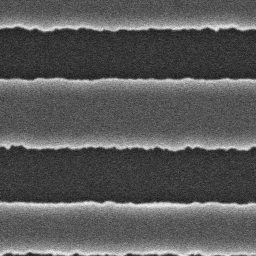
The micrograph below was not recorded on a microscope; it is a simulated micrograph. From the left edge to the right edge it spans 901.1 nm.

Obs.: lines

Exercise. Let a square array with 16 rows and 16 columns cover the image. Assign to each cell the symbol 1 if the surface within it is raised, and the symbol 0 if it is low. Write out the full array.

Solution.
1111111111111111
1111111111111111
0000000000000000
0000000000000000
0000000000000000
1111111111111111
1111111111111111
1111111111111111
1111111111111111
0000000000000000
0000000000000000
0000000000000000
0000000000000000
1111111111111111
1111111111111111
1111111111111111